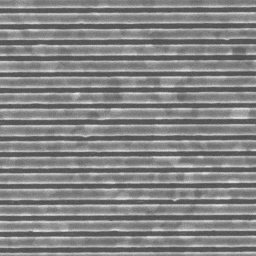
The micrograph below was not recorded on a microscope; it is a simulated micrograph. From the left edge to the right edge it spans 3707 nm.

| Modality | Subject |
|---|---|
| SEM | parallel lines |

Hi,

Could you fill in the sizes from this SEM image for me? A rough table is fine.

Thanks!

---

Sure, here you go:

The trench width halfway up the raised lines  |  79.7 nanometers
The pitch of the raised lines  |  0.231 micrometres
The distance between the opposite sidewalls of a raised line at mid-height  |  145 nanometres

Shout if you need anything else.